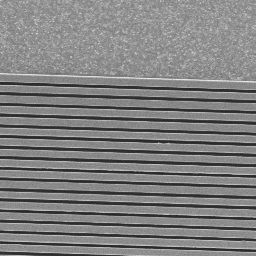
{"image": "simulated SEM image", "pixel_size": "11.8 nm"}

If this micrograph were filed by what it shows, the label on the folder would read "parallel lines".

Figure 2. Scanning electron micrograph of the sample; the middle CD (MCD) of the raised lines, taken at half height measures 96.1 nanometres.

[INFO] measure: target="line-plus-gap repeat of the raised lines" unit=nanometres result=126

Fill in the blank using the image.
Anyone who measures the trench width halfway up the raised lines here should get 32.5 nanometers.